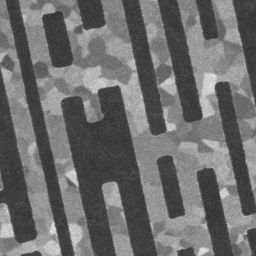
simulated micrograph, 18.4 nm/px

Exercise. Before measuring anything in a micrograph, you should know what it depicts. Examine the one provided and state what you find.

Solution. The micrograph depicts parallel lines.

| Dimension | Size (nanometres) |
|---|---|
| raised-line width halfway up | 327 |